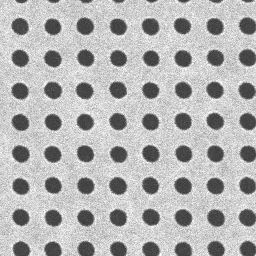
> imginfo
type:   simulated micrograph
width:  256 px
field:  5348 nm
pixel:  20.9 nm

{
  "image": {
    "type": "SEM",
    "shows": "a regular array of holes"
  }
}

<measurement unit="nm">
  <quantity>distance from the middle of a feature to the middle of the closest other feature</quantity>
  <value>661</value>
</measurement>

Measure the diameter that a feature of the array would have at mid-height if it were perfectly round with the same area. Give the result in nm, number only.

373